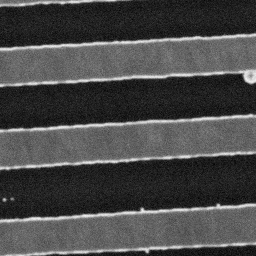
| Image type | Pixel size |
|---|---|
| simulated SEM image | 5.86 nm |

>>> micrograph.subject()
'lines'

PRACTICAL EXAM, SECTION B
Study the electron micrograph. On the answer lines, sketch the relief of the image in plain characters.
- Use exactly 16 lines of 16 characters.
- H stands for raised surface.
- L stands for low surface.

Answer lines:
LLLLLLLLLLLLLLLL
LLLLLLLLLLLLLLLL
LLLLLLLLLHHHHHHH
HHHHHHHHHHHHHHHH
HHHHHHHHHHHHHHHH
LLLLLLLLLLLLLLLL
LLLLLLLLLLLLLLLL
LLLLLLLLLLLHHHHH
HHHHHHHHHHHHHHHH
HHHHHHHHHHHHHHHH
HLLLLLLLLLLLLLLL
LLLLLLLLLLLLLLLL
LLLLLLLLLLLLLLLL
LLLLLHHHHHHHHHHH
HHHHHHHHHHHHHHHH
HHHHHHHHHHHLLLLL